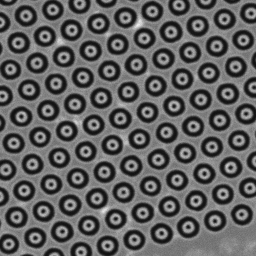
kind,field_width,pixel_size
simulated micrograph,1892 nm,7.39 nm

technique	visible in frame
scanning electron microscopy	a regular array of ring-shaped grooves with a dot in the middle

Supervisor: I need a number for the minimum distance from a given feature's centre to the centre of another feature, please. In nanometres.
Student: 201